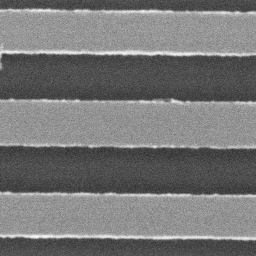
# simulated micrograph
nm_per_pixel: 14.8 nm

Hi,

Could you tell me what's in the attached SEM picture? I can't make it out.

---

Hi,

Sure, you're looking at lines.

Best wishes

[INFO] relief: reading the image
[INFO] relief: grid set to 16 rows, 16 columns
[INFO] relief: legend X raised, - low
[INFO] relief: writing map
----------------
XXXXXXXXXXXXXXXX
XXXXXXXXXXXXXXXX
----------------
----------------
----------------
XXXXXXXXXXXXXXXX
XXXXXXXXXXXXXXXX
XXXXXXXXXXXXXXXX
----------------
----------------
----------------
XXXXXXXXXXXXXXXX
XXXXXXXXXXXXXXXX
XXXXXXXXXXXXXXXX
----------------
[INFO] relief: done